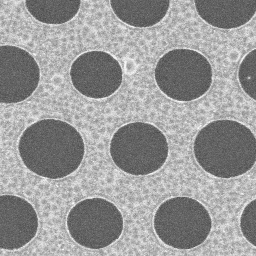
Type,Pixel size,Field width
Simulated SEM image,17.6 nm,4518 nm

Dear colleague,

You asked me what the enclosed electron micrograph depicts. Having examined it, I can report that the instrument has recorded holes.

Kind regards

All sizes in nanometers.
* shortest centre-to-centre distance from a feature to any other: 1520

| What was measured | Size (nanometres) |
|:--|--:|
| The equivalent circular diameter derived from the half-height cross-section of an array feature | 983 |